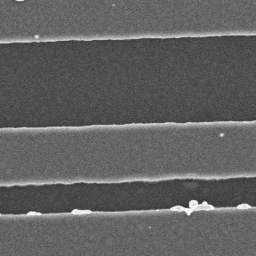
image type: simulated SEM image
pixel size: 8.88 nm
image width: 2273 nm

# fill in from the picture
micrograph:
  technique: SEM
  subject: lines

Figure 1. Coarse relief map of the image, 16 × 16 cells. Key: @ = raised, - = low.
@@@@@@@@@@@@@@@@
@@@@@@@@@@@@@@@@
@@@@-@----------
----------------
----------------
----------------
----------------
----------------
@@@@@@@@@@@@@@@@
@@@@@@@@@@@@@@@@
@@@@@@@@@@@@@@@@
@@@@@@@@@@@@@@@@
@@@@@@@@@@@@@@@@
@@@@@@@@@@@@@@@@
@@@@@@@@@@@@@@@@
@@@@@@@@@@@@@@@@